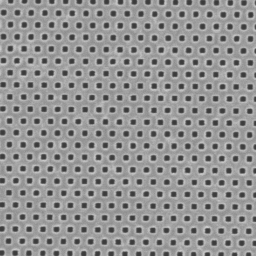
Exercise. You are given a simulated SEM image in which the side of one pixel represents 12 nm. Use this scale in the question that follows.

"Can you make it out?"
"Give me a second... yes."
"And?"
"a regular array of holes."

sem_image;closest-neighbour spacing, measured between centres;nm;162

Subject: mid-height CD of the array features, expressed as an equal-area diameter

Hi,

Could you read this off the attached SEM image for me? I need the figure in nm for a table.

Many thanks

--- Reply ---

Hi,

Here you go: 72.8